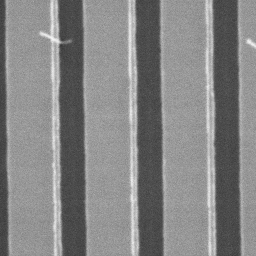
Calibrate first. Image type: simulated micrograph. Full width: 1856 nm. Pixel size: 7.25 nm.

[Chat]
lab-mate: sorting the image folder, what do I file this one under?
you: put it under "lines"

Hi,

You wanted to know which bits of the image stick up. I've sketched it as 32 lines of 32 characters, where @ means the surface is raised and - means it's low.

-@@@@@@---@@@@@@@---@@@@@@----@@
-@@@@@@----@@@@@@---@@@@@@----@@
-@@@@@@----@@@@@@---@@@@@@----@@
-@@@@@@----@@@@@@---@@@@@@----@@
-@@@@@@----@@@@@@---@@@@@@@---@@
-@@@@@@----@@@@@@---@@@@@@@---@@
-@@@@@@----@@@@@@---@@@@@@@---@@
-@@@@@@----@@@@@@---@@@@@@@---@@
-@@@@@@----@@@@@@---@@@@@@----@@
-@@@@@@----@@@@@@---@@@@@@@---@@
-@@@@@@----@@@@@@---@@@@@@@---@@
-@@@@@@----@@@@@@---@@@@@@@---@@
-@@@@@@----@@@@@@---@@@@@@@---@@
-@@@@@@----@@@@@@---@@@@@@@---@@
-@@@@@@----@@@@@@---@@@@@@@---@@
-@@@@@@----@@@@@@---@@@@@@@---@@
-@@@@@@----@@@@@@---@@@@@@@---@@
-@@@@@@----@@@@@@---@@@@@@@---@@
-@@@@@@----@@@@@@---@@@@@@@---@@
-@@@@@@----@@@@@@---@@@@@@@---@@
-@@@@@@----@@@@@@---@@@@@@@---@@
-@@@@@@----@@@@@@---@@@@@@@---@@
-@@@@@@----@@@@@@---@@@@@@@---@@
-@@@@@@----@@@@@@----@@@@@@---@@
-@@@@@@----@@@@@@----@@@@@@---@@
-@@@@@@----@@@@@@----@@@@@@---@@
-@@@@@@----@@@@@@----@@@@@@---@@
-@@@@@@----@@@@@@----@@@@@@---@@
-@@@@@@----@@@@@@----@@@@@@---@@
-@@@@@@----@@@@@@----@@@@@@---@@
-@@@@@@@---@@@@@@----@@@@@@---@@
-@@@@@@@---@@@@@@----@@@@@@---@@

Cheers